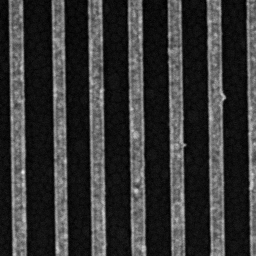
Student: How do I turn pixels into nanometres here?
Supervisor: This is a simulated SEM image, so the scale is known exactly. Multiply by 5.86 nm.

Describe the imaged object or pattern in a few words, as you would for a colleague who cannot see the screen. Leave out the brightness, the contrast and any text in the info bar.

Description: parallel lines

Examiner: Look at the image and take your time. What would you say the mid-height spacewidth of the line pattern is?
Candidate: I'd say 27.6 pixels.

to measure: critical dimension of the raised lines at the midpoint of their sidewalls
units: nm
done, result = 70.3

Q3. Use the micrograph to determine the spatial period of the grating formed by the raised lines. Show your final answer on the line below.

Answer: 232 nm